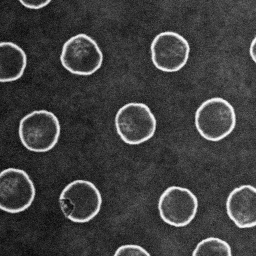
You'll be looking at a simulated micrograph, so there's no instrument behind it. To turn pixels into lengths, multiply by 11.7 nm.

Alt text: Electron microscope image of raised bodies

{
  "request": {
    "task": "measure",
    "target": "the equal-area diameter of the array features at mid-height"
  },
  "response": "440 nm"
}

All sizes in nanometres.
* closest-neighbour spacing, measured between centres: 953